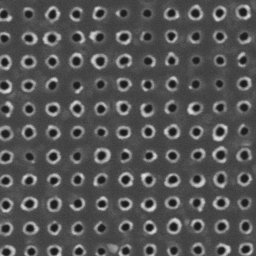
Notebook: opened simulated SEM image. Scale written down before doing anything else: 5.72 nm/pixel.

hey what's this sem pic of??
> a regular array of holes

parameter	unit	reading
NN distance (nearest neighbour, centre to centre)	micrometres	0.134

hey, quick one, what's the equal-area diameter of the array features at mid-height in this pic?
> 0.047 micrometres